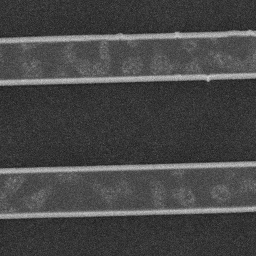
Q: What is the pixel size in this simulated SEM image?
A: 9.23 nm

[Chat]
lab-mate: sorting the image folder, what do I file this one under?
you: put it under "one or a few lines or trenches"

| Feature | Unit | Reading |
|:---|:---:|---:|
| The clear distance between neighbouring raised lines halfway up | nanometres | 799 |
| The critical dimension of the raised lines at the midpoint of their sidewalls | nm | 421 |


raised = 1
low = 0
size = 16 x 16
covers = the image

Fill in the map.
0000000000000000
0000000000000000
1111111111111111
1111111111111111
1111111111111111
0000000000000000
0000000000000000
0000000000000000
0000000000000000
0000000000000000
0000000111111111
1111111111111111
1111111111111111
1100000000000000
0000000000000000
0000000000000000